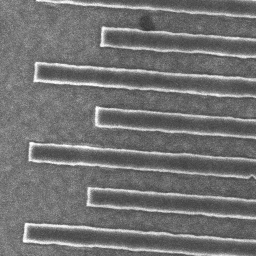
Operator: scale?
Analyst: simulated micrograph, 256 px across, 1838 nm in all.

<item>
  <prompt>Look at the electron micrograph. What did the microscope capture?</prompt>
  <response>parallel lines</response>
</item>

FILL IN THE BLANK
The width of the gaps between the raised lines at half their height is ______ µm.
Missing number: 0.157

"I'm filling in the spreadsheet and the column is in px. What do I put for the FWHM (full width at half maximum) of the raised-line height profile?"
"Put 18.5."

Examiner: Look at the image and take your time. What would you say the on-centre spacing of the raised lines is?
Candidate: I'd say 289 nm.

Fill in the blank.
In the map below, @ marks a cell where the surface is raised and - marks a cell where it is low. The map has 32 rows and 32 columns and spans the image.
----------@@@@@@@@@@@@@@@@@@@@@@
-----------------------@@@@@@@@@
--------------------------------
--------------------------------
-------------@@@@@@@@@@@@@@-----
-------------@@@@@@@@@@@@@@@@@@@
-----------------------@@@@@@@@@
--------------------------------
----@@@@@@@@--------------------
----@@@@@@@@@@@@@@@@@@@@@@------
----------@@@@@@@@@@@@@@@@@@@@@@
-----------------------@@@@@@@@@
--------------------------------
--------------------------------
------------@@@@@@@@@@@@--------
------------@@@@@@@@@@@@@@@@@@@@
---------------------@@@@@@@@@@@
--------------------------------
----@@@@@@@@--------------------
----@@@@@@@@@@@@@@@@@@@@@-------
--------@@@@@@@@@@@@@@@@@@@@@@@@
----------------------@@@@@@@@@@
--------------------------------
--------------------------------
-----------@@@@@@@@@@@@@@-------
-----------@@@@@@@@@@@@@@@@@@@@@
---------------------@@@@@@@@@@@
--------------------------------
---@@@@@@@@@--------------------
---@@@@@@@@@@@@@@@@@@@@@--------
-------@@@@@@@@@@@@@@@@@@@@@@@@@
---------------------@@@@@@@@@@@